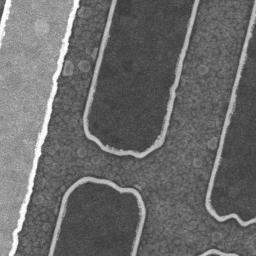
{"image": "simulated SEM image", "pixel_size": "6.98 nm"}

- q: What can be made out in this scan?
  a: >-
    one or a few lines or trenches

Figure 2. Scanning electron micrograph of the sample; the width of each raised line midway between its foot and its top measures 557 nanometres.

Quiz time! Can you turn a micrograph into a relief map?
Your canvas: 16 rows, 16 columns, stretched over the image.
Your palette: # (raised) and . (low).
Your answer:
#####..#####....
####...#####....
####...#####...#
####..#####....#
####..#####....#
###...#####....#
###...#####...##
###..#####....##
###...####....##
##.....##.....##
##...........###
##...##......###
##..#####....###
#...#####.....##
#...#####.......
#..#####........